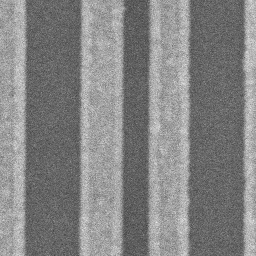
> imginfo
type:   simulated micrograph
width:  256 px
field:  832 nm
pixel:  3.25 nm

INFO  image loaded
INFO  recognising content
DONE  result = one or a few lines or trenches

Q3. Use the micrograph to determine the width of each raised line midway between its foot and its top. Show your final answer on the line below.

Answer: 105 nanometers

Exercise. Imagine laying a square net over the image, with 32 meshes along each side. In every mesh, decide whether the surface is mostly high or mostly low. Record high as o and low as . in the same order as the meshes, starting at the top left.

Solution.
oo.........oooo....oooo........o
ooo........oooo....oooo........o
ooo........oooo....oooo........o
ooo........oooo....oooo........o
ooo........oooo....oooo........o
ooo........oooo....oooo........o
ooo........oooo....oooo........o
ooo........oooo....oooo........o
ooo........oooo....oooo........o
oo.........oooo....oooo........o
oo.........oooo....oooo........o
ooo........oooo....oooo........o
oo.........oooo....oooo........o
oo.........oooo....oooo........o
oo.........oooo....oooo........o
oo.........oooo....oooo........o
ooo........oooo....oooo........o
oo.........oooo....oooo........o
oo.........oooo....oooo........o
oo.........oooo....oooo........o
oo.........oooo....oooo........o
oo.........oooo....oooo........o
oo.........oooo....oooo........o
oo.........oooo....oooo........o
oo.........oooo....oooo........o
oo.........oooo....oooo........o
oo.........oooo....oooo........o
oo.........oooo....oooo........o
oo.........oooo....oooo........o
ooo........oooo....oooo........o
oo.........oooo....oooo........o
oo.........oooo....oooo........o